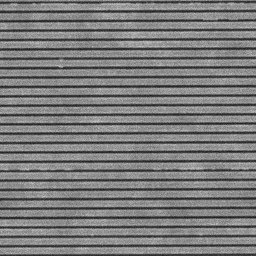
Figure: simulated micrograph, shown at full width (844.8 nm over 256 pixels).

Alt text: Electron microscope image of parallel lines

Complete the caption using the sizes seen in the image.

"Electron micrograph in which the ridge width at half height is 21.5 nm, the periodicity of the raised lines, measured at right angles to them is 30.9 nm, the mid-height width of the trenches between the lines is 9.1 nanometers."